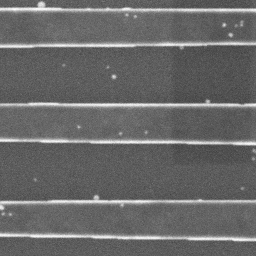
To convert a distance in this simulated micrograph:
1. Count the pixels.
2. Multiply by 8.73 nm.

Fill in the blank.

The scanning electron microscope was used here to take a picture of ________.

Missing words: lines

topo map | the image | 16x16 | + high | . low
................
++++++++++++++++
++++++++++++++++
................
................
................
.+++............
++++++++++++++++
++++++++++++++++
................
................
................
................
++++++++++++++++
++++++++++++++++
................